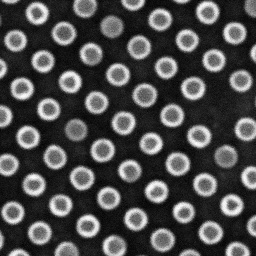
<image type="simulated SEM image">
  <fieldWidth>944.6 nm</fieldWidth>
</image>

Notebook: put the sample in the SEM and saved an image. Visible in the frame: a regular array of raised bodies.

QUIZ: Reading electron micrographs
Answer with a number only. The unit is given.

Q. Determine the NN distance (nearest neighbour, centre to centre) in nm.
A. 125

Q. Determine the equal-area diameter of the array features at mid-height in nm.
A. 80.4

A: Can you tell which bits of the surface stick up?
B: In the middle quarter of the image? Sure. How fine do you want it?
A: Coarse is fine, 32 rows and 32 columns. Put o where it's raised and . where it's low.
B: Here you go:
............ooo........ooooo....
...........ooooo.......ooooo....
ooo........ooooo........oooo....
oooo.......ooooo.........o......
oooo........oooo..............oo
oooo...............ooo........oo
ooo...............ooooo.......oo
.......ooo.......oooooo.......oo
......oooo........ooooo........o
......ooooo.......ooooo.........
......ooooo.........o.....oo....
......oooo...............oooo...
.............oooo.......oooooo..
.............oooo.......oooooo..
.oooo.......oooooo.......oooo...
.oooo.......oooooo.........o....
oooooo.......oooo..............o
.ooooo........o......oo........o
.oooo...............oooo.......o
........oooo.......ooooo........
.......ooooo.......oooooo.......
.......ooooo........oooo........
.......ooooo...............oo...
.......ooooo..............ooooo.
...............ooo........ooooo.
..............ooooo.......ooooo.
...ooo........ooooo.......ooooo.
..ooooo.......ooooo........ooo..
..ooooo.......oooo..............
..ooooo.........o.....oo........
...ooo...............oooo.......
..........ooo........ooooo......